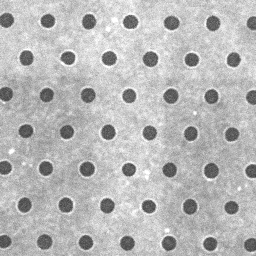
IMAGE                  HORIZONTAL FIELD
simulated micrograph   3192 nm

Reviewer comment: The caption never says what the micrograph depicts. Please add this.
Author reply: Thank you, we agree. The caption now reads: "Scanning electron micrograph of a regular array of holes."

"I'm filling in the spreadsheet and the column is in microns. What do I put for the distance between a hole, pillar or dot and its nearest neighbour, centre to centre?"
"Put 0.514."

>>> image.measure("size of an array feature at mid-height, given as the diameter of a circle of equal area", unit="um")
0.192